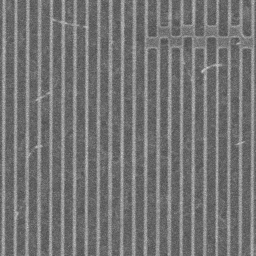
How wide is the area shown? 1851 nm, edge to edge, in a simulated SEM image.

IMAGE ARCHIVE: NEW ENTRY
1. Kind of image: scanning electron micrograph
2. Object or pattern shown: parallel lines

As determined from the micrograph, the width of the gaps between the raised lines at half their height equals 9.75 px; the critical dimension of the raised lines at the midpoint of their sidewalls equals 17.2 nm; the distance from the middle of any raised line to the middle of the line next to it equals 85.7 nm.